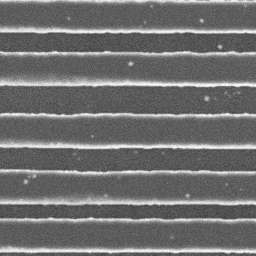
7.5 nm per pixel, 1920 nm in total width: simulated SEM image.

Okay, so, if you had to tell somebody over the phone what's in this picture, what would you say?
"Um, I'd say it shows lines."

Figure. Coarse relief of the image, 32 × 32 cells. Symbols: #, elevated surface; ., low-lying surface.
################################
################################
################################
################################
................................
................................
................................
################################
################################
################################
........##.#####################
................................
................................
................................
################################
################################
################################
################################
...........#..............######
................................
................................
##########.....############.....
################################
################################
################################
............................#...
................................
#####################.######.###
################################
################################
################################
................................